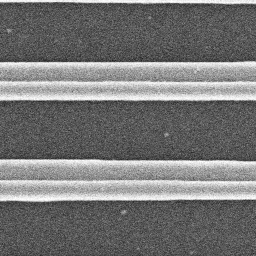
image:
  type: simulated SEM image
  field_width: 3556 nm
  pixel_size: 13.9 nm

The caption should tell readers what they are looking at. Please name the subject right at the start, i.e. lines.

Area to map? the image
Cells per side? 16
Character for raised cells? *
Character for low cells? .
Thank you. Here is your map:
................
................
................
................
****************
****************
................
................
................
................
****************
****************
................
................
................
................